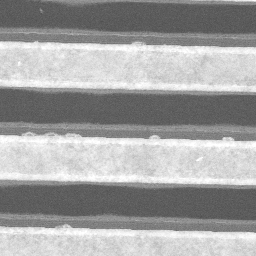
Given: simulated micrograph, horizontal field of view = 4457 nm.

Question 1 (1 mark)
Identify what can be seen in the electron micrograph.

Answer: lines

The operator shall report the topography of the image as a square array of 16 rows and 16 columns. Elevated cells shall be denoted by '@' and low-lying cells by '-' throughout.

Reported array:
----------------
----------------
@@@@@@@@@@@@@@@@
@@@@@@@@@@@@@@@@
@@@@@@@@@@@@@@@@
-----@@@@@@@@@@@
----------------
----------------
@@@@@@@@@@@@@@@@
@@@@@@@@@@@@@@@@
@@@@@@@@@@@@@@@@
-------------@@@
----------------
----------------
@@@@@@@@@@@@@@@@
@@@@@@@@@@@@@@@@